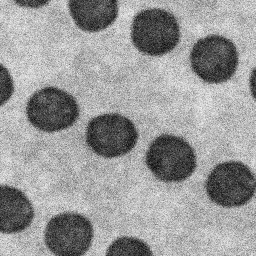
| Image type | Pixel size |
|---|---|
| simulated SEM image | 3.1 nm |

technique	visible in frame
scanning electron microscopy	holes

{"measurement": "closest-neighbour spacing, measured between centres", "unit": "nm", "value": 201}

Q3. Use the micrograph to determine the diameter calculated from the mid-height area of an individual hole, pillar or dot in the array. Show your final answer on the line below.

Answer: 158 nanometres